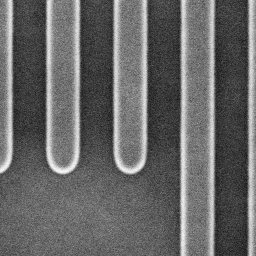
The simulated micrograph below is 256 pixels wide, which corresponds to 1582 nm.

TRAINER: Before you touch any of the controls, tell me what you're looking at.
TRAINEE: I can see groups of lines, slits or small figures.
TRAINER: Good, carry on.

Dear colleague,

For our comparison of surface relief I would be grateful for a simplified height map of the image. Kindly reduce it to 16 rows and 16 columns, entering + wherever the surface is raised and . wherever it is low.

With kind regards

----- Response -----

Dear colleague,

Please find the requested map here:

+..++..++..++...
+..++..++..++...
+..++..++..++...
+..++..++..++...
+..++..++..++...
+..++..++..++...
+..++..++..++...
+..++..++..++...
+..++..++..++...
+..++..++..++...
...+....+..++...
...........++...
...........++...
...........++...
...........++...
...........++...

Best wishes